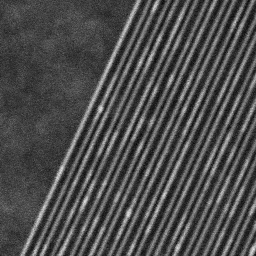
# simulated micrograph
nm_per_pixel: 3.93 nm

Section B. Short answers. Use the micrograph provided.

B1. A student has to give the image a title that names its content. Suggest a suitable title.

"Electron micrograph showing parallel lines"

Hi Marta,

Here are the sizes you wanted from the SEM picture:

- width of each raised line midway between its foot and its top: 0.0103 um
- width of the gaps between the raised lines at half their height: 6.82 pixels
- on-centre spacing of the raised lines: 34.1 nanometers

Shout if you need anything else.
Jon